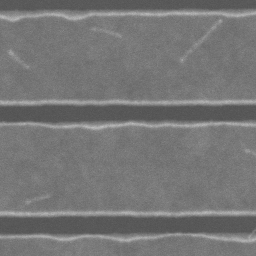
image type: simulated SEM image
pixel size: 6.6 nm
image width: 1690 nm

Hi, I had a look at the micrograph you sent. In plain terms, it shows lines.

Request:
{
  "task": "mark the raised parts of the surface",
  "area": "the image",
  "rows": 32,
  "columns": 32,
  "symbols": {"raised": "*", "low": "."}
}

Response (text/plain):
................................
.....................****.**...*
********************************
********************************
********************************
********************************
********************************
********************************
********************************
********************************
********************************
********************************
********************************
................................
................................
******....*..*******************
********************************
********************************
********************************
********************************
********************************
********************************
********************************
********************************
********************************
********************************
********************************
................................
................................
*******..*****...***********...*
********************************
********************************